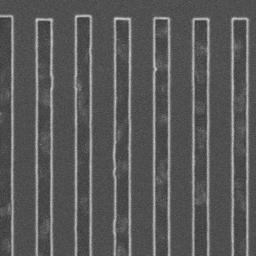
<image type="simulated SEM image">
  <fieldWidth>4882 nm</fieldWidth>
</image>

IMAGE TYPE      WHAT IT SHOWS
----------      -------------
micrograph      parallel lines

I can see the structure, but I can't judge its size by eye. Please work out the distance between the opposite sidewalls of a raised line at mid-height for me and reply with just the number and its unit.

0.481 µm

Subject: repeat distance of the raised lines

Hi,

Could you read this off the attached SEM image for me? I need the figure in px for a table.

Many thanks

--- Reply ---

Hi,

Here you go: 39.2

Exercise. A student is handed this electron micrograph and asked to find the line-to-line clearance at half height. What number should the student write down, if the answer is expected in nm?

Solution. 272